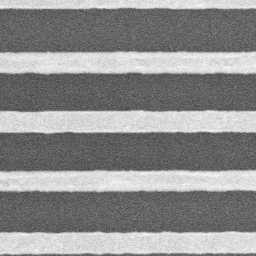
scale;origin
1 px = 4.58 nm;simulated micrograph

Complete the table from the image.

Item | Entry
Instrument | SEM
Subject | lines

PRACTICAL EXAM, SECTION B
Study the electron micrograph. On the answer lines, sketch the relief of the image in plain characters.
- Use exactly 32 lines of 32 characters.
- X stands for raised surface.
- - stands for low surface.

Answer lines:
XXXXXXXXXXXXXXXXXXXXXXXXXXXXXXXX
--------------------------------
--------------------------------
--------------------------------
--------------------------------
--------------------------------
--------------------------------
XXXXXXXXXXXXXXXXXXXXXXXXXXXXXXXX
XXXXXXXXXXXXXXXXXXXXXXXXXXXXXXXX
--------------------------------
--------------------------------
--------------------------------
--------------------------------
--------------------------------
XXXXXXXXXXXXXXXXXXXXXXXXXXXXXXXX
XXXXXXXXXXXXXXXXXXXXXXXXXXXXXXXX
-----XX-------------------------
--------------------------------
--------------------------------
--------------------------------
--------------------------------
-----X-XXXXXXXXXXXXXXXXXXXXXXXXX
XXXXXXXXXXXXXXXXXXXXXXXXXXXXXXXX
XXXXXXXXXXXXXXXXXXXXXXXXXXXXXXXX
--------------------------------
--------------------------------
--------------------------------
--------------------------------
--------------------------------
XXXXXXXXXXXXXXXXXXXXXXXXXXXXXXXX
XXXXXXXXXXXXXXXXXXXXXXXXXXXXXXXX
XXXXXXXXXXXXXXXXXXXXXXXXXXXXXXXX